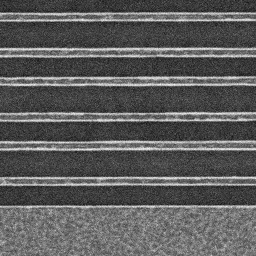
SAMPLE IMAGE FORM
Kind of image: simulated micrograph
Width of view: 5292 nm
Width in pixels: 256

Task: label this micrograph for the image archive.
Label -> parallel lines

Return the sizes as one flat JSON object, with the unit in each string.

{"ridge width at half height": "142 nm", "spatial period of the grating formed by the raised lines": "681 nm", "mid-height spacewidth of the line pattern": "25.1 px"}